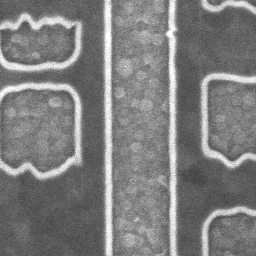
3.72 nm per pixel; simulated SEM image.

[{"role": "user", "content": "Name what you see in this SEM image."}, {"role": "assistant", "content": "one or a few lines or trenches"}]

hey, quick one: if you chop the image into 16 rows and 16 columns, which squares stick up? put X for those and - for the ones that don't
XXXXXXX----XX-XX
X---XXX----XXXXX
-----XX----XXXXX
-----XX----XXXXX
XXXXXXX----XXXXX
X---XXX----XX---
-----XX----XX---
-----XX----XX---
-----XX----XX---
-----XX----XX---
-X--XXX----XXXXX
XXXXXXX----XXXXX
XXXXXXX----XXXXX
XXXXXXX----XX---
XXXXXXX----XX---
XXXXXXX----XX---